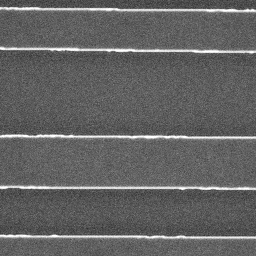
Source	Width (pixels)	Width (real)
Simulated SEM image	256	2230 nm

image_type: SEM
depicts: lines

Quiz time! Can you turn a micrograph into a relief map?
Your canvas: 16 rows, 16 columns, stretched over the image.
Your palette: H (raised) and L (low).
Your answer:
LLLLLLLLLLLLLLLL
HHHHHHHHHHHHHHHH
HHHHHHHHHHHHHHHH
LLLLLLLLLLLLLLLL
LLLLLLLLLLLLLLLL
LLLLLLLLLLLLLLLL
LLLLLLLLLLLLLLLL
LLLLLLLLLLLLLLLL
HHHHHLLLLLLLLLLL
HHHHHHHHHHHHHHHH
HHHHHHHHHHHHHHHH
HHHHHHHHHHHHHHHH
LLLLLLLLLLLLLLLL
LLLLLLLLLLLLLLLL
LLLLLLLLLLLLLLLL
HHHHHHHHHHHHHHHH